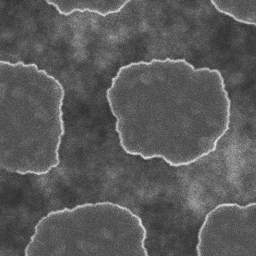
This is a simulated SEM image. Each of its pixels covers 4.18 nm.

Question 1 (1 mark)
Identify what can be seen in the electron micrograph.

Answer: raised bodies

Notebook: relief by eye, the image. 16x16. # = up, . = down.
....####......##
................
................
................
###....######...
####...#######..
####...#######..
####...#######..
####...#######..
####....#####...
###.............
................
................
...#####.....###
..#######....###
..#######...####